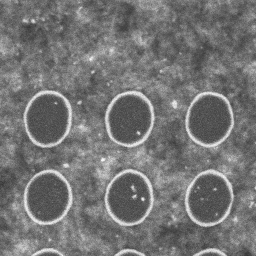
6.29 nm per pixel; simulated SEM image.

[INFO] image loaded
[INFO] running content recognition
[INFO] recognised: raised bodies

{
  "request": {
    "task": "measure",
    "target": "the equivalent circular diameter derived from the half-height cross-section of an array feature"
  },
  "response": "315 nm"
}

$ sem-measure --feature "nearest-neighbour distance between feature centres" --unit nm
496